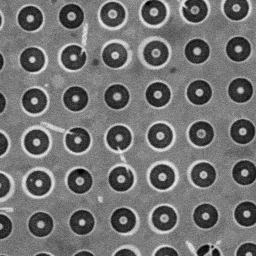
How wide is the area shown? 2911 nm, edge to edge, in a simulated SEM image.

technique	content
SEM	an array of small figures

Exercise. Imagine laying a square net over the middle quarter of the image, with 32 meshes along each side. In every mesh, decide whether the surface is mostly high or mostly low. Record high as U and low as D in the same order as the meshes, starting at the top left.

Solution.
DDDDDUUUUUUDDDDUUUUUUDDDDUUUUUUU
UDDUUUUUUUUUUUUUUUUUUUUUUUUUUUUU
UUUUUUUUUUUUUUUUUUUUUUUUUUUUUUUU
UUUUUUUUUUUUUUUUUUUUUUUUUUUUUUUU
UUUUUUUUUUUUUUUUUUUUUUUDDUUUUUUU
UUDUUUUUUUUDDDDUUUUUUDDDDDUUUUUD
UDDDDUUUUUDDDDDDUUUUUDDDDDDUUUUD
DDDDDDUUUUDDDDDDUUUUDDDUDDDUUUDD
DDDDDDUUUUDDDUDDUUUUDDDDDDDUUUUD
DDDDDDUUUUDDDDDDUUUUUDDDDDUUUUUU
DDDDDDUUUUUDDDDDUUUUUUDDDUUUUUUU
UDDDUUUUUUUUUUUUUUUUUUUUUUUUUUUU
UUUUUUUUUUUUUUUUUUUUUUUUUUUUUUUU
UUUUUUUUUUUUUUUUUUUUUUUUUUUUUUUU
UUUUUUUUUUUUUUUUUUUUUUUUUUUUUUUU
UUUUUUUUUUUUDDDUUUUUUUDDDDUUUUUU
UDDDDUUUUUUDDDDDUUUUUDDDDDDUUUUD
DDDDDDUUUUUDDDDDDUUUUDDDUDDDUUUD
DDDDDDDUUUDDDUDDDUUUUDDDUDDDUUUD
DDDDDDDUUUDDDDDDDUUUUDDDDDDUUUUU
DDDDDDDUUUUDDDDDUUUUUUDDDDUUUUUU
UDDDDDUUUUUUDDDDUUUUUUUUDUUUUUUU
UUUUUUUUUUUUUUUUUUUUUUUUUUUUUUUU
UUUUUUUUUUUUUUUUUUUUUUUUUUUUUUUU
UUUUUUUUUUUUUUUUUUUUUUUUUUUUUUUU
UUUUUUUUUUUUUDDUUUUUUUDDDDDUUUUU
UUDDDDUUUUUUDDDDDUUUUDDDDDDDUUUD
UDDDDDDUUUUDDDDDDDUUUDDDDDDDUUUD
UDDDDDDUUUUDDDUDDDUUUDDDUDDDUUUD
DDDUUDDUUUUDDDDDDDUUUDDDDDDDUUUU
UDDDDDDUUUUUDDDDDUUUUUDDDDDUUUUU
UUDDDDUUUUUUUDDDUUUUUUUUDDUUUUUU